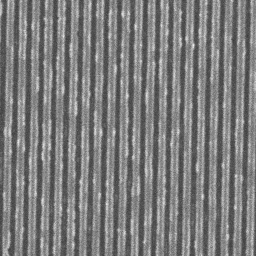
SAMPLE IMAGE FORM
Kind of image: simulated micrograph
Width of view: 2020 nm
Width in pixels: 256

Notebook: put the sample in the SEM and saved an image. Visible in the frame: parallel lines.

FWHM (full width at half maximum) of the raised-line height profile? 52.3 nm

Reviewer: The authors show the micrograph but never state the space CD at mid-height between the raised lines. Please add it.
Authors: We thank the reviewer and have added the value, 44.4 nm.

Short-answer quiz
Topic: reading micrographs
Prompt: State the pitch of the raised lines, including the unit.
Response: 0.101 microns